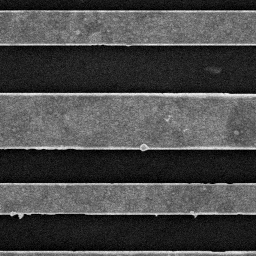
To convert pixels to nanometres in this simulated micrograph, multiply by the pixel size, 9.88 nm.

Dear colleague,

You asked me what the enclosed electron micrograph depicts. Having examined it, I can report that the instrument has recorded lines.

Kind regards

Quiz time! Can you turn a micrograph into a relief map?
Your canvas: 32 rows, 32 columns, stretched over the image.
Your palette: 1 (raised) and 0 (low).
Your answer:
00000000000000000000000000000000
11111111111111111111111111111111
11111111111111111111111111111111
11111111111111111111111111111111
11111111111111111111111111111111
11111111111101111111111111111111
00000000000000000000000000000000
00000000000000000000000000000000
00000000000000000000000000000000
00000000000000000000000000000000
00000000000000000000000000000000
00000000000000000000000000000000
11111111111111111111111111111111
11111111111111111111111111111111
11111111111111111111111111111111
11111111111111111111111111111111
11111111111111111111111111111111
11111111111111111111111111111111
11111111111111111111111111111111
00000000000000000000000000000000
00000000000000000000000000000000
00000000000000000000000000000000
00000000000000000000000000000000
11111111111111111111111111111111
11111111111111111111111111111111
11111111111111111111111111111111
11111111111111111111111111111111
00000000000000000000000000000000
00000000000000000000000000000000
00000000000000000000000000000000
00000000000000000000000000000000
11111111111111111111111110000011